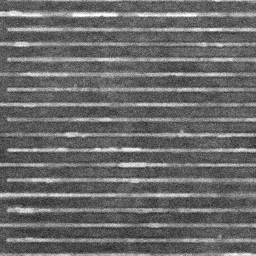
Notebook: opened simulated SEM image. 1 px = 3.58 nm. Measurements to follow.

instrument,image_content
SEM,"parallel lines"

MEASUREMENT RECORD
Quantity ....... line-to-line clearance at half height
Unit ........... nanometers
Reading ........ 43.4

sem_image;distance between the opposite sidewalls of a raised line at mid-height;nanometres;9.4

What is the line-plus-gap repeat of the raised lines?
54 nm